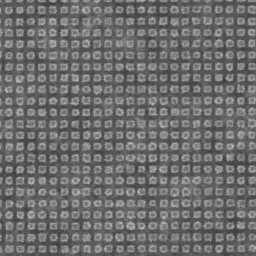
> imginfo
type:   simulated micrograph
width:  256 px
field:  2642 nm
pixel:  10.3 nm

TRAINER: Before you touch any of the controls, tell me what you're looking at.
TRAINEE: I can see a regular array of raised bodies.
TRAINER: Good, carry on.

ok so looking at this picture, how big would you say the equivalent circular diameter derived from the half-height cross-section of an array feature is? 0.0699 microns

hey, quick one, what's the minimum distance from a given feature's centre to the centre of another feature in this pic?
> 113 nm